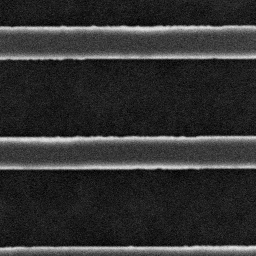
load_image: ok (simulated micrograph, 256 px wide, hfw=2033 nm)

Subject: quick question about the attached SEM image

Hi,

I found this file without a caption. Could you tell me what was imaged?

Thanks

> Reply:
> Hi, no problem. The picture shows lines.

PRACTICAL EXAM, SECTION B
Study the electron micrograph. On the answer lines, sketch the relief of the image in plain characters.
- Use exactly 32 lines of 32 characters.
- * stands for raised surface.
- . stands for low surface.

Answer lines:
................................
................................
................................
******************.*************
********************************
********************************
********************************
................................
................................
................................
................................
................................
................................
................................
................................
................................
................................
********************************
********************************
********************************
********************************
................................
................................
................................
................................
................................
................................
................................
................................
................................
................................
********************************